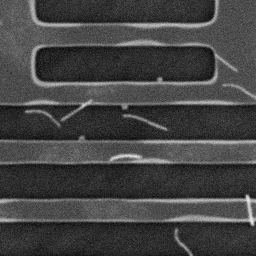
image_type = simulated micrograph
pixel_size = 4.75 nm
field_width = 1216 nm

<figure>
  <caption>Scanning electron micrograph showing groups of lines, slits or small figures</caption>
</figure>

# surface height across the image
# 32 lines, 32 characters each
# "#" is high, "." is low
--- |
####.......................#####
####.......................#####
#####......................#####
################################
################################
################...#############
####.......................#####
####.......................#####
####.......................#####
####.......................#####
######..###.####################
################################
################################
................................
................................
................................
................................
................................
################################
################################
................................
................................
................................
................................
................................
################################
################################
.#####################.......###
................................
................................
................................
................................